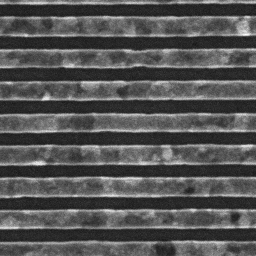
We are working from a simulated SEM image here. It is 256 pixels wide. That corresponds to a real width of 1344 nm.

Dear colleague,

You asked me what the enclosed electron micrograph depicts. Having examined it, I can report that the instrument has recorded parallel lines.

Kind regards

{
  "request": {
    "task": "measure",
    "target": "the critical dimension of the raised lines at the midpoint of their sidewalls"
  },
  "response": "91.9 nm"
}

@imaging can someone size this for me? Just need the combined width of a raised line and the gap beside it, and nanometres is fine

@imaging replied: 169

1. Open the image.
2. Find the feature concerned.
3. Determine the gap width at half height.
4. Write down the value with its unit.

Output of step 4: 74.2 nm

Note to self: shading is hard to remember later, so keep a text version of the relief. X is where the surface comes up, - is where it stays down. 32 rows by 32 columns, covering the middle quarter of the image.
XXXXXXXXXXXXXXXXX---XX-----XXXXX
--------------------------------
--------------------------------
--------------------------------
--------------X--XXXXX--XXXXX--X
XXXXXXXXXXXXXXXXXXXXXXXXXXXXXXXX
XXXXXXXXXXXXXXXXXXXXXXXXXXXXXXXX
XXXXXXXXXXXXXXXXXXXXXXXXXXXXXXXX
XXXXXXXXXXXXXXXXXXXXXXXXXXXXXXXX
--------------------------------
--------------------------------
--------------------------------
--------------------------------
XXXXXXXXXXXXXXXXXXXXXXXXXXXXXXXX
XXXXXXXXXXXXXXXXXXXXXXXXXXXXXXXX
XXXXXXXXXXXXXXXXXXXXXXXXXXXXXXXX
XXXXXXXXXXXXXXXXXXXXXXXXXXXXXX-X
--------------------------------
--------------------------------
--------------------------------
-------------------------------X
XXXXXXXXXXXXXXXXXXXXXXXXXXXXXXXX
XXXXXXXXXXXXXXXXXXXXXXXXXXXXXXXX
XXXXXXXXXXXXXXXXXXXXXXXXXXXXXXXX
XXXXXXXXXXXXXXXXXXXXXXXXXXXXXXXX
--------------------------------
--------------------------------
--------------------------------
-------XXX----------------------
XXXXXXXXXXXXXXXXXXXXXXXXXXXXXXXX
XXXXXXXXXXXXXXXXXXXXXXXXXXXXXXXX
XXXXXXXXXXXXXXXXXXXXXXXXXXXXXXXX